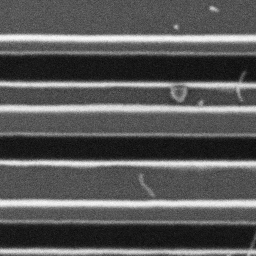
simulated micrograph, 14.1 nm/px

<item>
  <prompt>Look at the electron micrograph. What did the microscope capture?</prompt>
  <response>lines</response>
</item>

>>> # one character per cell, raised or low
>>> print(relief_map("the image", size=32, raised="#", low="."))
................................
................................
................................
................................
................................
################################
################################
################################
################################
################################
..................##############
................................
................................
................................
################################
################################
################################
################################
################################
################################
................................
................................
................................
................................
................................
#######.#.#........##...........
################################
################################
################################
################################
################################
...............................#